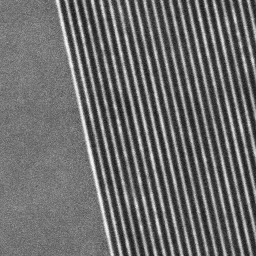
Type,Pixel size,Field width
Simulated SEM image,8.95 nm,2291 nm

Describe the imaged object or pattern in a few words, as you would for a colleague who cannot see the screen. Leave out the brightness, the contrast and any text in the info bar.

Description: parallel lines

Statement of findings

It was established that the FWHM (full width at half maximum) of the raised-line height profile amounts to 0.0153 um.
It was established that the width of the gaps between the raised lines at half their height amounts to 0.0612 microns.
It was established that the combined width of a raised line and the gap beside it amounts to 0.0759 um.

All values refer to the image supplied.